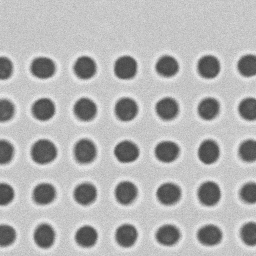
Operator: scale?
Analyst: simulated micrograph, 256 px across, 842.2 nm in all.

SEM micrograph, a regular array of holes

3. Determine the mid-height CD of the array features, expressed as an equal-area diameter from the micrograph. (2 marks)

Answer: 23.8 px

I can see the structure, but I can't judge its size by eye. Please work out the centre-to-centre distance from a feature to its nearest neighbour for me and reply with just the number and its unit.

135 nm